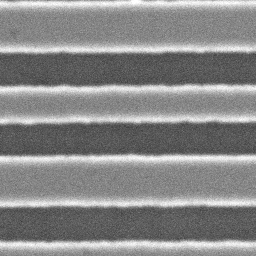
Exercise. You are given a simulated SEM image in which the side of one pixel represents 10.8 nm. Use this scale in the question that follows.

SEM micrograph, lines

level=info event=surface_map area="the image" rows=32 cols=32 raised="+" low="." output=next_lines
++++++++++++++++++++++++++++++++
++++++++++++++++++++++++++++++++
++++++++++++++++++++++++++++++++
++++++++++++++++++++++++++++++++
++++++++++++++++++++++++++++++++
++++++++++++++++++++++++++++++++
....++..........................
................................
................................
................................
................................
++++++++++++++++++++++++++++++++
++++++++++++++++++++++++++++++++
++++++++++++++++++++++++++++++++
++++++++++++++++++++++++++++++++
................................
................................
................................
................................
................................
++++++++++++++++++++++++++++++++
++++++++++++++++++++++++++++++++
++++++++++++++++++++++++++++++++
++++++++++++++++++++++++++++++++
++++++++++++++++++++++++++++++++
++++++++++++++++++++++++++++++++
................................
................................
................................
................................
++++++++++++++++++++++++++++++++
++++++++++++++++++++++++++++++++